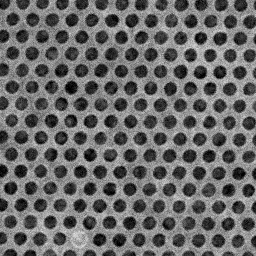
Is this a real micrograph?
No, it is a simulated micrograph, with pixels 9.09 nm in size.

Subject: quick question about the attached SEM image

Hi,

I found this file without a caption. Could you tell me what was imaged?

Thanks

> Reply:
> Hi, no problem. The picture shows a regular array of holes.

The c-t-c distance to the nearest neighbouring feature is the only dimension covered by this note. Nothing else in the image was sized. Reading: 0.175 µm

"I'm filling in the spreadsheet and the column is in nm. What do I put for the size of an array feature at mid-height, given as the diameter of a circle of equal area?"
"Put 131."